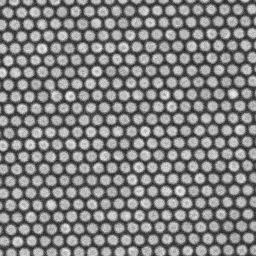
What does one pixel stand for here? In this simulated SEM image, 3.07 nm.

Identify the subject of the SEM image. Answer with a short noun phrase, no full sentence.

a regular array of raised bodies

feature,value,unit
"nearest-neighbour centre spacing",0.0411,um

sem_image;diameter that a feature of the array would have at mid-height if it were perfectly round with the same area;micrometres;0.0302